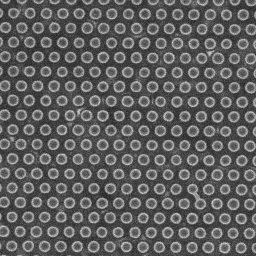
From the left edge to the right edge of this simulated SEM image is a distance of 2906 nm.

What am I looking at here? a regular array of raised bodies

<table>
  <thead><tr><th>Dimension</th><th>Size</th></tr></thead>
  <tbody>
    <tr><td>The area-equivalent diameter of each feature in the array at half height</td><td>115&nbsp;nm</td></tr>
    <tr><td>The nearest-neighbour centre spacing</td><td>184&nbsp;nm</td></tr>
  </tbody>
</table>